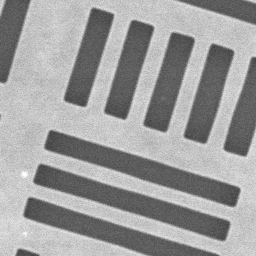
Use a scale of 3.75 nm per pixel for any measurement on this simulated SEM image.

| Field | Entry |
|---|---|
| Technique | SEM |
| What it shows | groups of lines, slits or small figures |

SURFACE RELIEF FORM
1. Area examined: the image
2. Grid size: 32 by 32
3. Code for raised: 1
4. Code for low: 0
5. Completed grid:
00001111111111111111111000000000
00011111111000111111111111100000
00011111111000111111111111111100
00011111111000110001111111111111
00011111110000110001100011111111
00111111110001100001100011111111
00111111110001100011100011000111
00111111100001100011000011000110
01111111100011000011000110000110
01111111100011000111000110001110
11111111000011000110000110001100
11111111000111000110001100001100
11111111000110000110001100001100
11111111111110001100001100011000
11111111111111001100001100011000
11111111111111111100011000011000
11111101111111111111011000110000
11111100000111111111111000110000
11111100000000111111111111110001
11111111000000000011111111111101
11111111111000000000011111111111
11110000011111100000000011111111
11110000000011111100000000011111
11111100000000011111100000000011
11111111100000000001111100000011
11100001111110000000001111110011
11100000001111110000000001111111
11110000000001111110000000001111
11111110000000001111110000000111
11111111111000000000111111001111
11111111111111000000000111111111
11001111111111111000000000111111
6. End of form